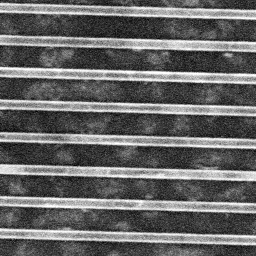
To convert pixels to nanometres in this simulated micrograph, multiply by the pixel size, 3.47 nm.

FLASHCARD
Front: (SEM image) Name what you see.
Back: parallel lines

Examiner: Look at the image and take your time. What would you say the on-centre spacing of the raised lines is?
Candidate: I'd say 112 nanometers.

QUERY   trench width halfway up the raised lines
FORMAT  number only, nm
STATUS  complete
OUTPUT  83.3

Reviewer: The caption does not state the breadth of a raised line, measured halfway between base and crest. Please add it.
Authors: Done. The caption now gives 31.2 nm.